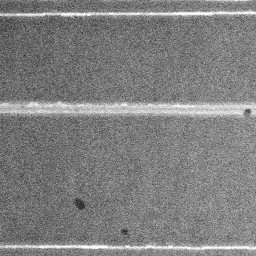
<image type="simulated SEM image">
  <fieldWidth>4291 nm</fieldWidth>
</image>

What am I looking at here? lines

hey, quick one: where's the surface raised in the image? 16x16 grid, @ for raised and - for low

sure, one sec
@@@@@@@@@@@@@@@@
----------------
----------------
----------------
----------------
----------------
----------------
----------------
----------------
----------------
----------------
----------------
----------------
----------------
----------------
@@@@@@@@@@@@@@@@